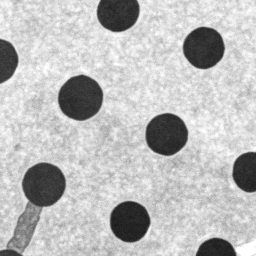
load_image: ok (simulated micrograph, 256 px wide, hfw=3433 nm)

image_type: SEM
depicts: holes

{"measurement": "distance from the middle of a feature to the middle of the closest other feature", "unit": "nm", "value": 1260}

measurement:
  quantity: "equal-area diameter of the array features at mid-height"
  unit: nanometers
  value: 570